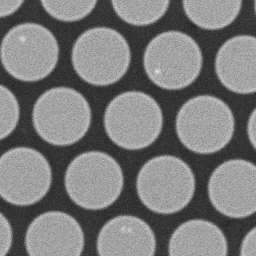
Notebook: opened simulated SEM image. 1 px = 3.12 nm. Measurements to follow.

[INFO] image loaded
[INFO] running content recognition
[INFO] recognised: an array of small figures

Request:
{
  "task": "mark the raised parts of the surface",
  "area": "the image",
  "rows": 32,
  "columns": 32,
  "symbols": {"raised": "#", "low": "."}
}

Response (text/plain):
###..#######..#######..#######..
##....#####....######..#######..
........##......####....#####...
..####......#.............##....
.######...#####.....###.......#.
#######..#######...######...####
#######..#######..#######..#####
#######..#######..#######..#####
.######..#######..#######..#####
..####....#####....######..#####
............##......####....####
#.....####......#.............##
##...######...#####.....###.....
##..#######..#######...######...
##..#######..#######..#######..#
##..#######..#######..#######..#
#....######..#######..#######..#
......####....#####....######..#
..#.............##......####....
#####.....####......#...........
######...######...#####.....###.
######..#######..#######...#####
######..#######..#######..######
######..#######..#######..######
#####....######..#######..######
..##......####....#####....#####
......#.............##......####
#...#####.....####......#.......
#...######...######...#####.....
#..#######..#######...######...#
#..#######..#######..#######..##
#...######..#######..#######..##